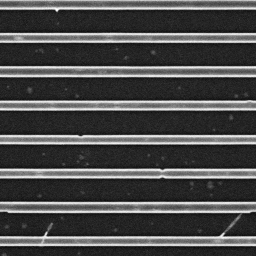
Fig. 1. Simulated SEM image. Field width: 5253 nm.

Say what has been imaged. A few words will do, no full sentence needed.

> parallel lines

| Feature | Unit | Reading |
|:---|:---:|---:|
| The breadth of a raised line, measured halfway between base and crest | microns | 0.172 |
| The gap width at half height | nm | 516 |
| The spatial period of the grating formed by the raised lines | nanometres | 696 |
